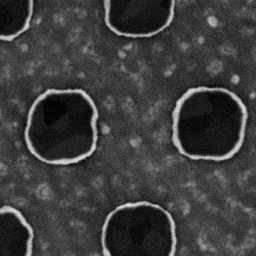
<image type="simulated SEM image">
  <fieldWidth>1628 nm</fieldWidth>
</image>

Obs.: raised bodies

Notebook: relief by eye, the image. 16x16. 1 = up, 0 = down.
1100000111100000
1100000111000000
0000000000000000
0000000000000000
0000000000000000
0000000000000000
0011110000011110
0011110000011110
0011110000011110
0011110000011110
0000000000000000
0000000000000000
0000000000000000
1000000111100000
1100001111100000
1100000111100000